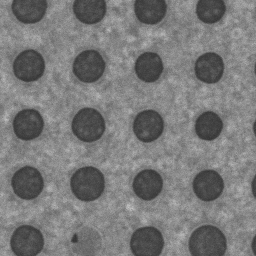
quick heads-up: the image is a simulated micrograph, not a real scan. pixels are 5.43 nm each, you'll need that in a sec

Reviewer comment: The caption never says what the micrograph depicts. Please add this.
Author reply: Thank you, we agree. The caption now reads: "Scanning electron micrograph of a regular array of holes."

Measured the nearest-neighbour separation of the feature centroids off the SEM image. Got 318 nanometers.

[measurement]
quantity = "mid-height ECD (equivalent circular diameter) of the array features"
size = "177 nm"